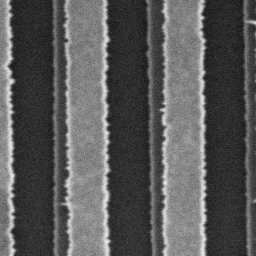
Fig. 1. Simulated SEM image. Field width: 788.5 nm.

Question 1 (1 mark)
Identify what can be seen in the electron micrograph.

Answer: lines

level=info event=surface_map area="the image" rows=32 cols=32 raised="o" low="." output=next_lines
o.......ooooo........oooo.......
o.......ooooo.......ooooo.......
o.......ooooo........oooo.......
o.......ooooo.......ooooo.......
o.......ooooo........oooo.......
o.......ooooo.......oooooo......
o.......ooooo.......ooooo.......
o.......ooooo........oooo.......
o.......ooooo........oooo.......
o.......ooooo........oooo.......
oo......ooooo........oooo.......
o.......ooooo.......ooooo.......
o.......ooooo........ooooo......
o.......ooooo.......ooooo.......
o.......ooooo.......oooooo......
o.......ooooo.......oooooo......
o.......ooooo........ooooo......
o.......ooooo........ooooo......
oo......ooooo.......ooooo.......
o.......ooooo.......oooooo......
o........oooo.......oooooo......
oo.......oooo........ooooo......
oo......ooooo.......oooooo......
o.......ooooo.......oooooo......
oo......oooooo.......ooooo......
oo......ooooo........ooooo......
oo.......oooo.......oooooo......
oo.......oooo.......oooooo......
oo......ooooo.......ooooo.......
o........oooo.......oooooo......
oo.......ooooo.......ooooo......
oo.......ooooo......oooooo......